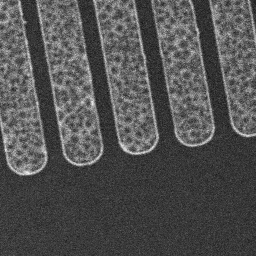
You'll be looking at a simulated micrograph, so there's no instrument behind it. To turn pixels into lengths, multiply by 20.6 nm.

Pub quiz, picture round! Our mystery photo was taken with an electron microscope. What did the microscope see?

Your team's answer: parallel lines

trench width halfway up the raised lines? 366 nm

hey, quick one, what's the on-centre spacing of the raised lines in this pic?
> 56.2 pixels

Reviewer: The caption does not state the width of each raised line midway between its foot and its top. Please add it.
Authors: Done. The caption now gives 0.787 micrometres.